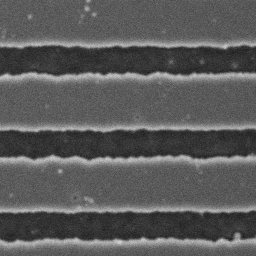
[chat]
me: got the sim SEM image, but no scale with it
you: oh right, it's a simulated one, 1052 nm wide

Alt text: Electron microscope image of lines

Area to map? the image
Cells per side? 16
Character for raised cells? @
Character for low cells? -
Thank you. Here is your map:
@@@@@@@@@@@@@@@@
@@@@@@@@@@@@@@@@
@@@@@@@@@@@@@@@@
----------------
----------------
@@@@@@@@@@@@@@@@
@@@@@@@@@@@@@@@@
@@@@@@@@@@@@@@@@
----------------
----------------
@@@@@@@@@@@@@@@@
@@@@@@@@@@@@@@@@
@@@@@@@@@@@@@@@@
----------------
----------------
@@@@@@@@@@@@@@@@